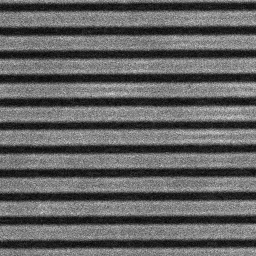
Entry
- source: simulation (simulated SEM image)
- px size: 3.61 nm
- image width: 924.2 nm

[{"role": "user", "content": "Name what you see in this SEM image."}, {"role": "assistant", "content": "parallel lines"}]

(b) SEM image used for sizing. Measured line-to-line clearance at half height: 10.9 px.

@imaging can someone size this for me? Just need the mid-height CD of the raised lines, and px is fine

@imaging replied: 12.7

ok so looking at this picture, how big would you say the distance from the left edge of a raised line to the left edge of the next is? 85.5 nm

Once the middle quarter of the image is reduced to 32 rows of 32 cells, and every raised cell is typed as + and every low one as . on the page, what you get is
++++++++++++++++++++++++++++++++
++++++++++++++++++++++++++++++++
................................
................................
................................
++++++++++++++++++++++++++++++++
++++++++++++++++++++++++++++++++
++++++++++++++++++++++++++++++++
................................
................................
................................
++++++++++++++++++++++++++++++++
++++++++++++++++++++++++++++++++
++++++++++++++++++++++++++++++++
................................
................................
................................
++++++++++++++++++++++++++++++++
++++++++++++++++++++++++++++++++
++++++++++++++++++++++++++++++++
................................
................................
................................
++++++++++++++++++++++++++++++++
++++++++++++++++++++++++++++++++
++++++++++++++++++++++++++++++++
................................
................................
................................
++++++++++++++++++++++++++++++++
++++++++++++++++++++++++++++++++
++++++++++++++++++++++++++++++++